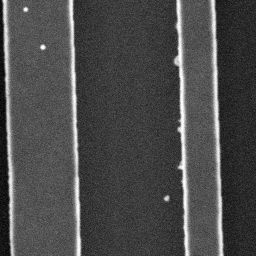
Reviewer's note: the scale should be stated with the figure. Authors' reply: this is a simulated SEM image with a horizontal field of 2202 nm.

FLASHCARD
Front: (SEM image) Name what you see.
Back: lines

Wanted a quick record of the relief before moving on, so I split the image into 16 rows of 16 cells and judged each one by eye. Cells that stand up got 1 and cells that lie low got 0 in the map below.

1111100000011000
1111100000011000
1111100000011000
1111100000011000
1111100000011000
1111100000011100
1111100000011100
1111100000011100
1111100000011100
0111100000011100
0111100000011100
0111100000011100
0111100000001100
0111100000001100
0111100000001100
0111100000001100